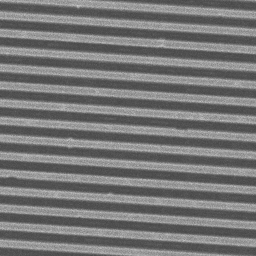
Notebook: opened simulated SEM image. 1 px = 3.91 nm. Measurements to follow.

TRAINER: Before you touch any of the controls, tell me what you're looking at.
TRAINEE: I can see parallel lines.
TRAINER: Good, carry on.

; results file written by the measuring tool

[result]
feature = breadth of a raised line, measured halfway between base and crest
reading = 35.5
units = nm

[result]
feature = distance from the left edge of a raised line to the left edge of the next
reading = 17.5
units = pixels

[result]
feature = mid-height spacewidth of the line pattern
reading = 0.0326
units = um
